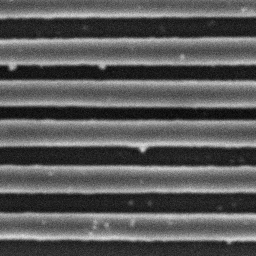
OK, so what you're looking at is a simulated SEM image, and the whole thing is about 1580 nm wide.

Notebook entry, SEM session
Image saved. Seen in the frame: lines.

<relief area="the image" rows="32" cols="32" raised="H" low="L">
HHHHHHHHHHHHHHHHHHHHHHHHHHHHHHHH
HHHHHHHHHHHHHHHHHHHHHHHHHHHHHHHH
LLLLLLLLLLLLLLLLLLLLLLLLLLLLLLLL
LLLLLLLLLLLLLLLLLLLLLLLLLLLLLLLL
LLLLLLLLLLLLLLLLLLLLLLLLLLLLLLLL
HHHHHHHHHHHHHHHHHHHHHHHHHHHHHHHH
HHHHHHHHHHHHHHHHHHHHHHHHHHHHHHHH
HHHHHHHHHHHHHHHHHHHHHHHHHHHHHHHH
LLLLLLLLLLLLLLLLLLLLLLLLLLLLLLLL
LLLLLLLLLLLLLLLLLLLLLLLLLLLLLLLL
HHHHHHHHHHHHHHHHHHHHHHHHHHHHHHHH
HHHHHHHHHHHHHHHHHHHHHHHHHHHHHHHH
HHHHHHHHHHHHHHHHHHHHHHHHHHHHHHHH
LLLLLLLLLLLLLLLLLLLLLLLLLLLLLLLL
LLLLLLLLLLLLLLLLLLLLLLLLLLLLLLLL
HHHHHHHHHHHHHHHHHHHHHHHHHHHHHHHH
HHHHHHHHHHHHHHHHHHHHHHHHHHHHHHHH
HHHHHHHHHHHHHHHHHHHHHHHHHHHHHHHH
LLLLLLLLLLLLLLLLLLLLLLLLLLLLLLLL
LLLLLLLLLLLLLLLLLLLLLLLLLLLLLLLL
LLLLLLLLLLLLLLLLLLLLLLLLLLLLLLLL
HHHHHHHHHHHHHHHHHHHHHHHHHHHHHHHH
HHHHHHHHHHHHHHHHHHHHHHHHHHHHHHHH
HHHHHHHHHHHHHHHHHHHHHHHHHHHHHHHH
LLLLLLLLLLLLLLLLLLLLLLLLLLLLLLLL
LLLLLLLLLLLLLLLLLLLLLLLLLLLLLLLL
LLLLLLLLLLLLLLLLLLLLLLLLLLLLLLLL
HHHHHHHHHHHHHHHHHHHHHHHHHHHHHHHH
HHHHHHHHHHHHHHHHHHHHHHHHHHHHHHHH
HHHHHHHHHHHHHHHHHHHHHHHHHHHHHHHH
LLLLLLLLLLLLLLLLLLLLLLLLLLLLLLLL
LLLLLLLLLLLLLLLLLLLLLLLLLLLLLLLL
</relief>